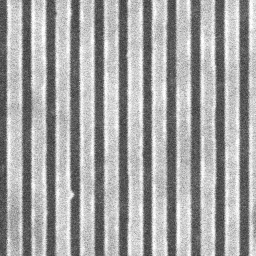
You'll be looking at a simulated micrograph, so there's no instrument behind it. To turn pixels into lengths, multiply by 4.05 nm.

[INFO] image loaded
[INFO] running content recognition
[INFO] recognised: parallel lines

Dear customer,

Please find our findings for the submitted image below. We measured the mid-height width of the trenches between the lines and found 0.0395 micrometres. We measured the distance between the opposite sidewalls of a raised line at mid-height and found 13.6 px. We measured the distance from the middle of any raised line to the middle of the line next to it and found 97.9 nm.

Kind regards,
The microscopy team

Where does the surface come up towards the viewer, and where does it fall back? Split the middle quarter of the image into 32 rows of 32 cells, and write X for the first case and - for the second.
X---XXX---XXX---XXXX--XXX---XXX-
X---XXX---XXX---XXXX--XXX---XXX-
X---XXX---XXX---XXXX--XXX---XXX-
X---XXX---XXX---XXXX--XXX---XXX-
X---XXX---XXX---XXXX--XXX---XXX-
X---XXX---XXX---XXXX--XXX---XXX-
X---XXX---XXX---XXXX--XXX---XXX-
X---XXX---XXX---XXXX--XXX---XXX-
X---XXX---XXX---XXXX--XXX---XXX-
X---XXX---XXX---XXXX--XXX---XXX-
X---XXX---XXX---XXXX--XXX---XXX-
X---XXX---XXX---XXXX--XXX---XXX-
X---XXX---XXX---XXXX--XXX---XXX-
X---XXX---XXX---XXXX--XXX---XXX-
X---XXX---XXX---XXXX--XXX---XXX-
X---XXX---XXX---XXXX--XXX---XXX-
X---XXX---XXX---XXXX--XXX---XXX-
X---XXX---XXX---XXXX--XXX---XXX-
X---XXX---XXX---XXXX--XXX---XXX-
X---XXX---XXX---XXXX--XXX---XXX-
X---XXX---XXX---XXXX--XXX---XXX-
X---XXX---XXX---XXXX--XXX---XXX-
X---XXX---XXX---XXXX--XXX---XXX-
X---XXX---XXX---XXXX--XXX---XXX-
X---XXX---XXX---XXXX--XXX---XXX-
X---XXX---XXX---XXXX--XXX---XXX-
X---XXX---XXX---XXXX--XXX---XXX-
XX--XXX---XXX---XXXX--XXX---XXX-
XX--XXX---XXX---XXXX--XXX---XXX-
XX--XXX---XXX---XXXX--XXX---XXX-
XX--XXX---XXX---XXXX--XXX---XXX-
XX--XXX---XXX---XXXX--XXX---XXX-